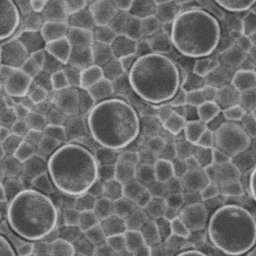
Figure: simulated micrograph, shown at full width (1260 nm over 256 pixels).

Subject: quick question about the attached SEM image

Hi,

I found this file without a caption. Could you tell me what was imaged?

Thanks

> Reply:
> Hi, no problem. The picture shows raised bodies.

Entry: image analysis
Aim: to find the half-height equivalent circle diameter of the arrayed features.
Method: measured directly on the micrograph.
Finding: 237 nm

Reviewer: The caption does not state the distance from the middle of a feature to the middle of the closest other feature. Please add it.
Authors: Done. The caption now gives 0.3 microns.